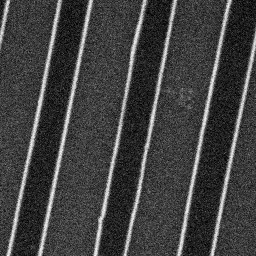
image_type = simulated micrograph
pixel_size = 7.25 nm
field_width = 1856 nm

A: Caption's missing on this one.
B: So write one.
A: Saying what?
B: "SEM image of one or a few lines or trenches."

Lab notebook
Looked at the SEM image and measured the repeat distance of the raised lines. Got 605 nanometres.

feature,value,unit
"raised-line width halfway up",228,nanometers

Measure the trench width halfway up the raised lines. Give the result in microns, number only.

0.371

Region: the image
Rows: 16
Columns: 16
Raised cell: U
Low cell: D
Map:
DDDDUUDDDUUDDDUU
DDDUUDDDDUUDDDUU
DDDUUDDDUUDDDDUU
DDDUUDDDUUDDDDUU
DDDUUDDDUUDDDUUU
DDDUUDDDUUDDDUUD
DDUUDDDDUUDDDUUD
DDUUDDDDUUDDDUUD
DDUUDDDUUDDDDUUD
DDUUDDDUUDDDUUUD
DDUUDDDUUDDDUUDD
DUUDDDDUUDDDUUDD
DUUDDDDUUDDDUUDD
DUUDDDUUDDDDUUDD
DUUDDDUUDDDUUUDD
DUUDDDUUDDDUUDDD